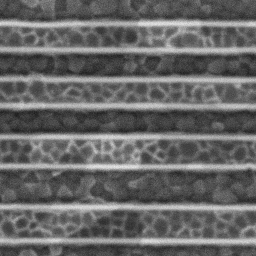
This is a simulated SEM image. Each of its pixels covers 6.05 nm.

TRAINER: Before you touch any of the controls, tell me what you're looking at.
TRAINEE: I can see one or a few lines or trenches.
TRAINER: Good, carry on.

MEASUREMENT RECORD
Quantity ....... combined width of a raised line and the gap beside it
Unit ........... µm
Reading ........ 0.378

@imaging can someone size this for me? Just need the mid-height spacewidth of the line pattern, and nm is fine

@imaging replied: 192